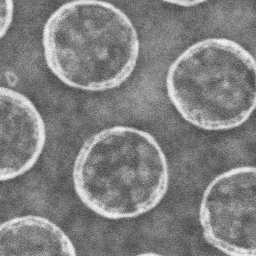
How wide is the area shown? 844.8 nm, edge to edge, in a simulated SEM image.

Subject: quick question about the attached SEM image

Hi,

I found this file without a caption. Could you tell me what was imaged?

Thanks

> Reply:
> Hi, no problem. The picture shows raised bodies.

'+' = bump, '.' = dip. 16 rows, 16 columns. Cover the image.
+...+++.........
...+++++........
...++++++.......
...++++++..+++++
...+++++...+++++
.....++....+++++
++.........+++++
++..........+++.
+++...+++.......
++...+++++......
++...+++++......
.....+++++...+++
.....+++++...+++
.......+.....+++
++++.........+++
++++..........++